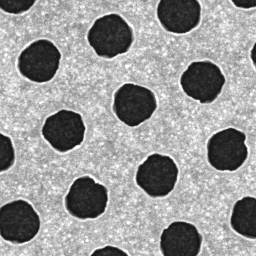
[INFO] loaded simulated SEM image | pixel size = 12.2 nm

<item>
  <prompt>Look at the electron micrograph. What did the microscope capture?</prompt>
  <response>a regular array of holes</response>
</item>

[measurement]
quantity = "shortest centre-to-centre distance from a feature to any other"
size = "0.885 microns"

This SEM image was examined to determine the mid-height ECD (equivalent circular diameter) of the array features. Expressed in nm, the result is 515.